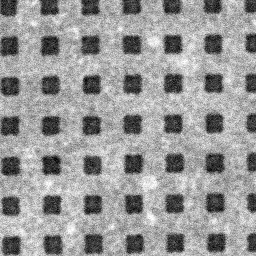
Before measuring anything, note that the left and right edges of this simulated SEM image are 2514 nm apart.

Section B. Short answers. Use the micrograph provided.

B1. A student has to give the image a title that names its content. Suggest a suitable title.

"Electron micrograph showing a regular array of holes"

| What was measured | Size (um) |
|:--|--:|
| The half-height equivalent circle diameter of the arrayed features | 0.215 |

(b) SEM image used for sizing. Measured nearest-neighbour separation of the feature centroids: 389 nm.